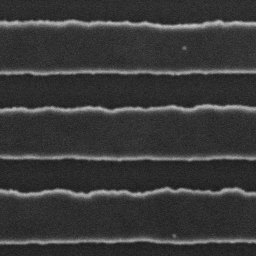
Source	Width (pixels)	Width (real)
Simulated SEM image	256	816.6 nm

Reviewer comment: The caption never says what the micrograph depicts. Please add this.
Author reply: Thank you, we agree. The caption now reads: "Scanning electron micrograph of lines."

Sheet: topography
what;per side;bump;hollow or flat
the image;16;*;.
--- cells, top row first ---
................
**********..****
****************
****************
****************
................
................
****************
****************
****************
................
................
****************
****************
****************
................